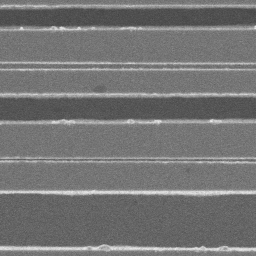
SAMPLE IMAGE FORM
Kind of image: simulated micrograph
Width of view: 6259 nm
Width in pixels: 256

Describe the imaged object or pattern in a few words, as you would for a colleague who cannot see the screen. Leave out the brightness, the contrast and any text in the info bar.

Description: lines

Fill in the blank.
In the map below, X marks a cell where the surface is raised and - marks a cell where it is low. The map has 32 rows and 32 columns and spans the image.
XXXXXXXXXXXXXXXXXXXXXXXXXXXXXXXX
--------------------------------
--------------------------------
------XX--------X--------------X
XXXXXXXXXXXXXXXXXXXXXXXXXXXXXXXX
XXXXXXXXXXXXXXXXXXXXXXXXXXXXXXXX
XXXXXXXXXXXXXXXXXXXXXXXXXXXXXXXX
XXXXXXXXXXXXXXXXXXXXXXXXXXXXXXXX
XXXXXXXXXXXXXXXXXXXXXXXXXXXXXXXX
XXXXXXXXXXXXXXXXXXXXXXXXXXXXXXXX
XXXXXXXXXXXXXXXXXXXXXXXXXXXXXXXX
XXXXXXXXXXXXXXXXXXXXXXXXXXXXXXXX
--------------------------------
--------------------------------
--------------------------------
XXXXXXXXXXXXXXXXXXXXXXXXXXXXXXXX
XXXXXXXXXXXXXXXXXXXXXXXXXXXXXXXX
XXXXXXXXXXXXXXXXXXXXXXXXXXXXXXXX
XXXXXXXXXXXXXXXXXXXXXXXXXXXXXXXX
XXXXXXXXXXXXXXXXXXXXXXXXXXXXXXXX
XXXXXXXXXXXXXXXXXXXXXXXXXXXXXXXX
XXXXXXXXXXXXXXXXXXXXXXXXXXXXXXXX
XXXXXXXXXXXXXXXXXXXXXXXXXXXXXXXX
XXXXXXXXXXXXXXXXXXXXXXXXXXXXXXXX
--------------------------------
--------------------------------
--------------------------------
--------------------------------
--------------------------------
--------------------------------
--------------------------------
XXXXXXXXXXXXXXXXXXXXXXXXXXXXXXXX